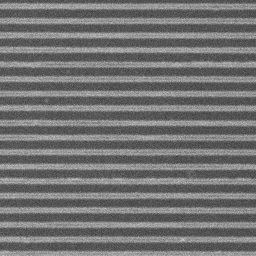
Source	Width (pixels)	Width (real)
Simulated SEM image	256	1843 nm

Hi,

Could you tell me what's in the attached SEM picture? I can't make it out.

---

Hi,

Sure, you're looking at parallel lines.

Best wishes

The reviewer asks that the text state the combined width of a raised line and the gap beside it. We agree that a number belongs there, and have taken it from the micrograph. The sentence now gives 105 nm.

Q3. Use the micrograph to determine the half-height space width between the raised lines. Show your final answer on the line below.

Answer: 81.8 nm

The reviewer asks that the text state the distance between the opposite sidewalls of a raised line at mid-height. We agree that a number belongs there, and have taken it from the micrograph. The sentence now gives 25.2 nm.